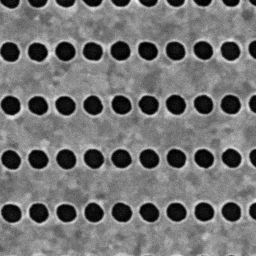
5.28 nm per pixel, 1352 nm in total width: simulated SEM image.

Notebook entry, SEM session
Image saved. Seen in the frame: a regular array of holes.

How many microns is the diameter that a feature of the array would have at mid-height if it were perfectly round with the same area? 0.11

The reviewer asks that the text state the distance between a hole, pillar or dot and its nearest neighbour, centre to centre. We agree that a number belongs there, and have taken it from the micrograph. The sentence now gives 144 nm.